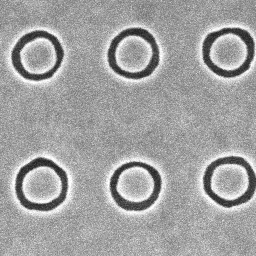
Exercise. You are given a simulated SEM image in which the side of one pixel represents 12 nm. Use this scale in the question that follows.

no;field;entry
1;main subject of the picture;ring-shaped grooves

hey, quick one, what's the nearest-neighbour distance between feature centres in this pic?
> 1140 nanometres